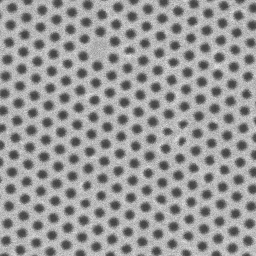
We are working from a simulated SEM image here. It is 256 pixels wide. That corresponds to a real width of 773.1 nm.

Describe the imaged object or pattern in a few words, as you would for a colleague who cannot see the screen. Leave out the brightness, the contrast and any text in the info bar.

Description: a regular array of holes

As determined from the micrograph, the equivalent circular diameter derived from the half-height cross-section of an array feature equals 30.3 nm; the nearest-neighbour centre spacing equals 51.5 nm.